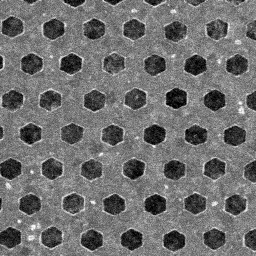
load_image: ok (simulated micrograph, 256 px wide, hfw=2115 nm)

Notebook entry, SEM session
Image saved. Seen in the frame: a regular array of holes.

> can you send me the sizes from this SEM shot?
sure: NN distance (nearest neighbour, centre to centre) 0.324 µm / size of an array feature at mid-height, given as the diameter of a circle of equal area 0.181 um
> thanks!